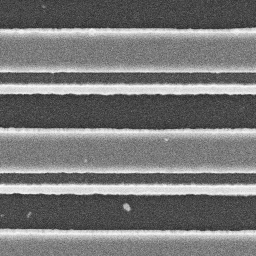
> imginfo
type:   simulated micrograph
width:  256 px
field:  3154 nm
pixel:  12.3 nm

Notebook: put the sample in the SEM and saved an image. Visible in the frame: lines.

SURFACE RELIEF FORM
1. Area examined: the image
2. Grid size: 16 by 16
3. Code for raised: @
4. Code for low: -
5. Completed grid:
----------------
----------------
@@@@@@@@@@@@@@@@
@@@@@@@@@@@@@@@@
@@@@@@@@@@@@@@@@
@@@@@@@@@@@@@@@@
----------------
----------------
@@@@@@@@@@@@@@@@
@@@@@@@@@@@@@@@@
@@@@@@@@@@@@@@@@
@@@@@@@@@@@@@@@@
----------------
----------------
@@@-------------
@@@@@@@@@@@@@@@@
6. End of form